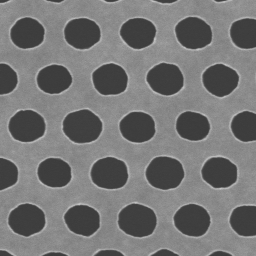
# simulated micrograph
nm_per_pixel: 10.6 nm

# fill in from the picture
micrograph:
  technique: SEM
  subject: a regular array of holes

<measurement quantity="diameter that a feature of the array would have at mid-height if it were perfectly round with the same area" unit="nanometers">362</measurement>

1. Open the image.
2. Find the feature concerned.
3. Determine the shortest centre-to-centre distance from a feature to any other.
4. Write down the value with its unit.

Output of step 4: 574 nanometres